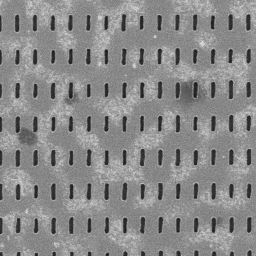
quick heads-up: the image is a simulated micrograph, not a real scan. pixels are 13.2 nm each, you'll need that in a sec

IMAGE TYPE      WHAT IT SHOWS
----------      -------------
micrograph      a regular array of holes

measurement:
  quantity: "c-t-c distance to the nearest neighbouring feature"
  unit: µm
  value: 0.234